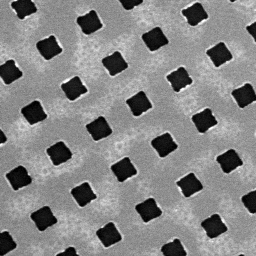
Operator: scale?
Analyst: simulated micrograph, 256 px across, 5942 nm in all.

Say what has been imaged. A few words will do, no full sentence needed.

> a regular array of holes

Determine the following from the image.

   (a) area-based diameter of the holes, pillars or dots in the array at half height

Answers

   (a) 552 nm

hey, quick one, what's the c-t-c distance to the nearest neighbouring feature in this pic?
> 1090 nanometres